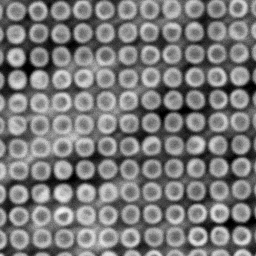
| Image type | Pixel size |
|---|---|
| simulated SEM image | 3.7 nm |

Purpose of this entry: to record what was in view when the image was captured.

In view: a regular array of raised bodies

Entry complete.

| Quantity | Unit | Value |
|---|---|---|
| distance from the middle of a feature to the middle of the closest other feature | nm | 81.1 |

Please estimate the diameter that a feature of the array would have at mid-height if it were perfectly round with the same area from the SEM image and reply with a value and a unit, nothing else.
67.6 nanometers